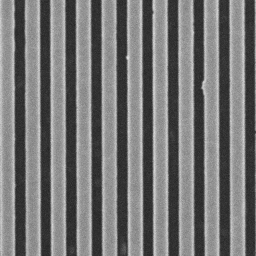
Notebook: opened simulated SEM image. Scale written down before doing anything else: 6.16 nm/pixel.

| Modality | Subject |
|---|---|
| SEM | parallel lines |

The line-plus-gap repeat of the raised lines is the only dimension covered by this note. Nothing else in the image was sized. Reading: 158 nanometers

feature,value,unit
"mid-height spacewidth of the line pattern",70.1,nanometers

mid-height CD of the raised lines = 85.5 nanometers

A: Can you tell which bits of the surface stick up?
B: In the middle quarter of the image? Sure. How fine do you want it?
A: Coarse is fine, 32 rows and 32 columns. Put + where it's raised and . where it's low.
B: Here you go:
...++++...+++...+++...++++...+++
...++++...+++...+++...++++...+++
...++++...+++...+++...++++...+++
...++++...+++...+++...++++...+++
...++++...+++...+++...++++...+++
...++++...+++...+++...++++...+++
...++++...+++...+++...++++...+++
...++++...+++...+++...++++...+++
...++++...+++...+++...++++...+++
...++++...+++...+++...++++...+++
...++++...+++...+++...++++...+++
...++++...+++...+++...++++...+++
...++++...+++...+++...++++...+++
...++++...+++...+++...++++...+++
...++++...+++...+++...++++...+++
...++++...+++...+++...++++...+++
...++++...+++...+++...++++...+++
...++++...+++...+++...++++...+++
...++++...+++...+++....+++...+++
...++++...+++...+++....+++...+++
...++++...+++...+++....+++...+++
...++++...+++...+++....+++...+++
...++++...+++...+++....+++...+++
...++++...+++...+++....+++...+++
...++++...+++...+++....+++...+++
...++++...+++...+++....+++...+++
...++++...+++...+++....+++...+++
...++++...+++...+++....+++...+++
...++++...+++...+++....+++...+++
...++++...+++...+++....+++...+++
...++++...+++...+++....+++...+++
...++++...+++...+++....+++...+++